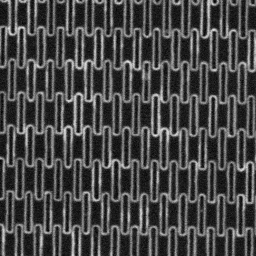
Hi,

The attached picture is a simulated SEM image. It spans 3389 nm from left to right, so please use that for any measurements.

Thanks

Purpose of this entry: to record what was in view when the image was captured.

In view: a regular array of holes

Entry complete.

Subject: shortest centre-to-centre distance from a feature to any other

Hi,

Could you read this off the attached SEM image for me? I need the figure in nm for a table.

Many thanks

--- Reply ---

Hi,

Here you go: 251